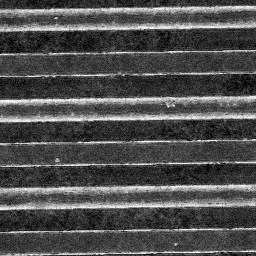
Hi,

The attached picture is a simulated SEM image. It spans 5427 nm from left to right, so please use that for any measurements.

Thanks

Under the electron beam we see lines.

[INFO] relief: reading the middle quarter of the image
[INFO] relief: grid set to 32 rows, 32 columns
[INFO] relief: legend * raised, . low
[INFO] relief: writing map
********************************
********************************
*************************.......
................................
................................
................................
................................
................................
................................
********************************
********************************
********************************
********************************
*********.......................
................................
................................
................................
................................
................................
.................***************
********************************
********************************
********************************
********************************
********************************
................................
................................
................................
................................
................................
................................
***..**.************************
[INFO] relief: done